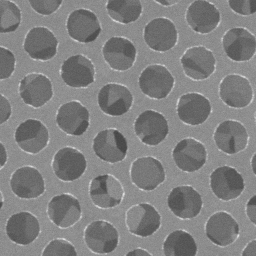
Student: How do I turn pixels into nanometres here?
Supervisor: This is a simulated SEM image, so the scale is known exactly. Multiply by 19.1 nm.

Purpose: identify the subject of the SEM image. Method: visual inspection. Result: a regular array of raised bodies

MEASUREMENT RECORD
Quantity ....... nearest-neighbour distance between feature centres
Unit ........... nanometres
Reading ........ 862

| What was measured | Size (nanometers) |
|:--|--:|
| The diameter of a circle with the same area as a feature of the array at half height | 654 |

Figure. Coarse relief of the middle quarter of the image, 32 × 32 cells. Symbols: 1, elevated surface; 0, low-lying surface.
11111110000111111000011110000011
11111111000001110000111111000011
11111111000000000001111111100011
11111111000000000001111111100000
11111110000000000001111111110000
01111100001111100001111111100000
00000000011111110001111111100000
00000000011111111000111111000011
00000000111111111000001110000111
01110000011111111000000000001111
11111000011111111000000000001111
11111100011111110000000000001111
11111100000111100001111100001111
11111100000000000011111110000111
11111100000000000011111111000011
11111100000000000011111111000000
11111100001110000011111111000000
01111000111111000011111111000000
00000000111111100001111110000000
00000001111111110000111100000111
00000001111111110000000000001111
11100001111111110000000000011111
11111000111111110000000000011111
11111000011111100001110000011111
11111100000110000111111100001111
11111100000000000111111110001111
11111000000000000111111110000111
11111000000000000111111110000000
11110000111110000111111110000000
00000001111111000111111110000000
00000001111111000011111000000110
00000011111111100000110000011111